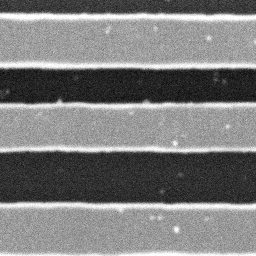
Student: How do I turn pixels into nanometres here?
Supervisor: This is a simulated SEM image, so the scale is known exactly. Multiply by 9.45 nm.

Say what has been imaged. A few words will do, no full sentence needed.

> lines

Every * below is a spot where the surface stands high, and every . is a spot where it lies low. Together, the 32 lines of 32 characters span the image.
................................
................................
********************************
********************************
********************************
********************************
********************************
********************************
.......***.*.....*****.*..*.....
................................
................................
................................
................................
********************************
********************************
********************************
********************************
********************************
********************************
................................
................................
................................
................................
................................
................................
..*********.....................
********************************
********************************
********************************
********************************
********************************
********************************